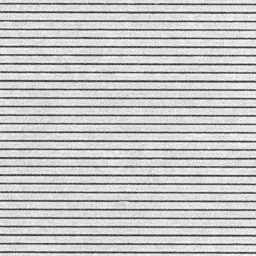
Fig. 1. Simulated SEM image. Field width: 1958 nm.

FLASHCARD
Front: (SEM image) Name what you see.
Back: parallel lines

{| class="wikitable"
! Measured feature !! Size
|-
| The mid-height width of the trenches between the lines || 18.2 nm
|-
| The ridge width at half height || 49.7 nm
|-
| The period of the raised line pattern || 65.6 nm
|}